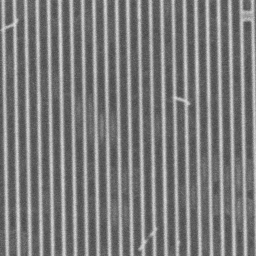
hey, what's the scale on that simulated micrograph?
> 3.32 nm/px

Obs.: parallel lines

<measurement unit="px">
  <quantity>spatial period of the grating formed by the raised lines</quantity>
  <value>11.3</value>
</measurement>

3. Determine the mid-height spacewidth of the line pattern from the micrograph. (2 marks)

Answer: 29.1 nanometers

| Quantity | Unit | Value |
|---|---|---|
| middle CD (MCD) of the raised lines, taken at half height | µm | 0.0066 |